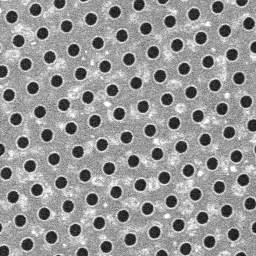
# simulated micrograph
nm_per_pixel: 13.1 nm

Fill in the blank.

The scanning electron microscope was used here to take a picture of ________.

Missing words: a regular array of holes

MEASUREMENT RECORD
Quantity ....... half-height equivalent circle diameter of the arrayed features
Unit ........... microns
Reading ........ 0.168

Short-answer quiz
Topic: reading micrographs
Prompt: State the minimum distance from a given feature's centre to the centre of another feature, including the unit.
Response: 322 nm